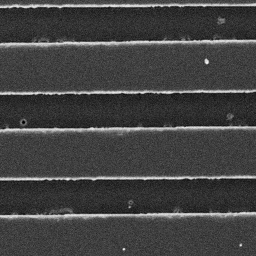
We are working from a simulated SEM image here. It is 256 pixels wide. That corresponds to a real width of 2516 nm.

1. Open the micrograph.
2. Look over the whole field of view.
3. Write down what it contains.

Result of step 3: lines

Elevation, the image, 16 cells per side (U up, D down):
DDDDDDDDDDDDDDDD
DDDDDDDDDDDDDDDD
DDDDDDDDDDDDDDDD
UUUUUUUUUUUUUUUU
UUUUUUUUUUUUUUUU
UUUUUUUUUUUUUUUU
DDDDDDDDDDDDDDDD
DDDDDDDDDDDDDDDD
UUUUUUUUUUUUUUUU
UUUUUUUUUUUUUUUU
UUUUUUUUUUUUUUUU
DDDDDDDDDDDDDDDD
DDDDDDDDDDDDDDDD
UUUUUUUUUUUUUUUU
UUUUUUUUUUUUUUUU
UUUUUUUUUUUUUUUU